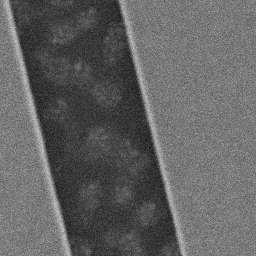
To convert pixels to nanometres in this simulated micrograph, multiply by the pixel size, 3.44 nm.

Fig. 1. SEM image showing one or a few lines or trenches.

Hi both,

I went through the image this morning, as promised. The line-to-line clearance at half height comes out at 384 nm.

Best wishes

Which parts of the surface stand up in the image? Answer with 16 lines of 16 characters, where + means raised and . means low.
+.......++++++++
+.......++++++++
+.......++++++++
+.......++++++++
+........+++++++
++.......+++++++
++.......+++++++
++.......+++++++
++........++++++
+++.......++++++
+++.......++++++
+++.......++++++
+++........+++++
++++.......+++++
++++.......+++++
++++.......+++++